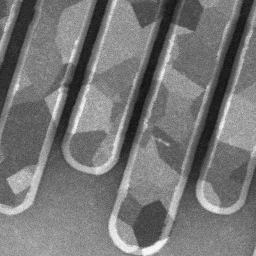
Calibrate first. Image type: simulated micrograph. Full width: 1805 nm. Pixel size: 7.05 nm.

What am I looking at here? one or a few lines or trenches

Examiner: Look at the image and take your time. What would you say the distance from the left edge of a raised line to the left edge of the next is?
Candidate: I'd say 482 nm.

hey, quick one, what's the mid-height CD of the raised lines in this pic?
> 49.8 pixels